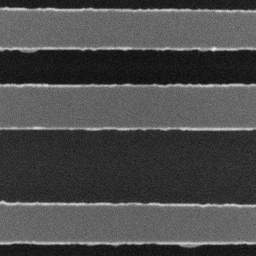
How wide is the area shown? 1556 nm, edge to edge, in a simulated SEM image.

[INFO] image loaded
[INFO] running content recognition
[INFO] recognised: lines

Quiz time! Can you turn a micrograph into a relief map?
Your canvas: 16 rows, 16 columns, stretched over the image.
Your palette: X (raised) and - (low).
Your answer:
X---------------
XXXXXXXXXXXXXXXX
XXXXXXXXXXXXXXXX
----------------
----------------
XXXXXXXXXXXXXXXX
XXXXXXXXXXXXXXXX
XXXXXXXXXXXXXXXX
----------------
----------------
----------------
----------------
----------------
XXXXXXXXXXXXXXXX
XXXXXXXXXXXXXXXX
----------------